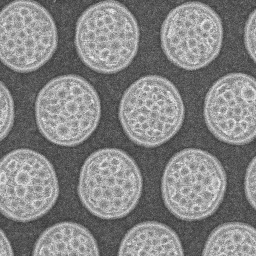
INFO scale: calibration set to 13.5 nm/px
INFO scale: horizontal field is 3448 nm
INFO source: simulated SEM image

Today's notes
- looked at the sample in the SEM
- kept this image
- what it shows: raised bodies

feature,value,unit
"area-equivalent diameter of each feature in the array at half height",887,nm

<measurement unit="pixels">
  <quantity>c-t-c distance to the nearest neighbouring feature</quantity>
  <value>83.4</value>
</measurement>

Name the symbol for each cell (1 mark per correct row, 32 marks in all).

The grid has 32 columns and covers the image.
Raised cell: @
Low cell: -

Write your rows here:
-@@@@--------@@-----------------
@@@@@@-----@@@@@-----@@@@@@-----
@@@@@@----@@@@@@@----@@@@@@----@
@@@@@@@---@@@@@@@---@@@@@@@@---@
@@@@@@@---@@@@@@@---@@@@@@@@---@
@@@@@@@---@@@@@@@---@@@@@@@@---@
@@@@@@@---@@@@@@@----@@@@@@----@
@@@@@@----@@@@@@------@@@@------
--@@-------@@@@--------@@-------
----------------------------@@@-
------@@@@@------@@@@------@@@@@
@----@@@@@@@----@@@@@@----@@@@@@
@----@@@@@@@---@@@@@@@@---@@@@@@
@@---@@@@@@@---@@@@@@@@---@@@@@@
@@---@@@@@@@---@@@@@@@@---@@@@@@
@----@@@@@@@---@@@@@@@@---@@@@@@
@----@@@@@@-----@@@@@@-----@@@@@
------@@@@-------@@@@-------@@@-
--------------------------------
-@@@@------@@@@@------@@@@------
@@@@@@-----@@@@@@----@@@@@@----@
@@@@@@@---@@@@@@@----@@@@@@@---@
@@@@@@@---@@@@@@@@--@@@@@@@@---@
@@@@@@@---@@@@@@@@--@@@@@@@@---@
@@@@@@@---@@@@@@@----@@@@@@@---@
@@@@@@@----@@@@@@----@@@@@@-----
@@@@@@------@@@@------@@@@------
--------------------------------
------@@@@-------@@@@------@@@@-
@----@@@@@@-----@@@@@@----@@@@@@
@----@@@@@@@---@@@@@@@----@@@@@@
@@--@@@@@@@@---@@@@@@@@---@@@@@@